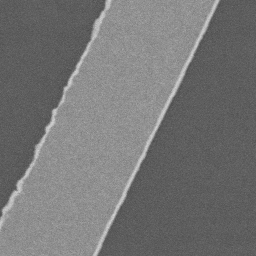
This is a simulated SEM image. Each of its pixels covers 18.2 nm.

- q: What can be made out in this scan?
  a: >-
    one or a few lines or trenches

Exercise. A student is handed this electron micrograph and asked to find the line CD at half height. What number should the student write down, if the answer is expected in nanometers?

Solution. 1770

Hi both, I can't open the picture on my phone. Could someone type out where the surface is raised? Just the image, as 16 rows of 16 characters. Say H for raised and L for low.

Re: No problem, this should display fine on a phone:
LLLLLLLHHHHHHLLL
LLLLLLHHHHHHHLLL
LLLLLLHHHHHHLLLL
LLLLLHHHHHHHLLLL
LLLLLHHHHHHLLLLL
LLLLHHHHHHHLLLLL
LLLLHHHHHHLLLLLL
LLLHHHHHHHLLLLLL
LLLHHHHHHLLLLLLL
LLHHHHHHHLLLLLLL
LLHHHHHHHLLLLLLL
LHHHHHHHLLLLLLLL
LHHHHHHHLLLLLLLL
HHHHHHHLLLLLLLLL
HHHHHHHLLLLLLLLL
HHHHHHLLLLLLLLLL